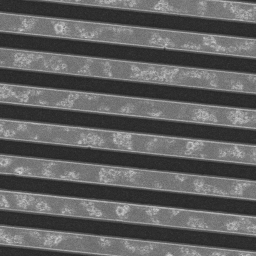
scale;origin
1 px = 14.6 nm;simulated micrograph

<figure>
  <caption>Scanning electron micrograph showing parallel lines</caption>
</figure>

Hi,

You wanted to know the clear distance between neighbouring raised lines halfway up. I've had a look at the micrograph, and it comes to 16.2 px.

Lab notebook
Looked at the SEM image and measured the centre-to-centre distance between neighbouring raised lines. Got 514 nm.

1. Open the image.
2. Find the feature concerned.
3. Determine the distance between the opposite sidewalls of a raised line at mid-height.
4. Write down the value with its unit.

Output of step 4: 0.284 microns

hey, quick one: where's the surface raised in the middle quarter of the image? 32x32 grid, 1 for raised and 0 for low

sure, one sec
11111111111111111111111111100000
11111111111111111111111111111111
01111111111111111111111111111111
00000000001111111111111111111111
00000000000000000000111111111111
00000000000000000000000000000011
10000000000000000000000000000000
11111111110000000000000000000000
11111111111111111111000000000000
11111111111111111111111111111000
11111111111111111111111111111111
00011111111111111111111111111111
00000000000111111111111111111111
00000000000000000000011111111111
00000000000000000000000000000000
10000000000000000000000000000000
11111111110000000000000000000000
11111111111111111111000000000000
11111111111111111111111111111100
11111111111111111111111111111111
00011111111111111111111111111111
00000000000001111111111111111111
00000000000000000000001111111111
00000000000000000000000000000000
10000000000000000000000000000000
11111111111000000000000000000000
11111111111111111111000000000000
11111111111111111111111111111100
11111111111111111111111111111111
00011111111111111111111111111111
00000000000001111111111111111111
00000000000000000000000111111111